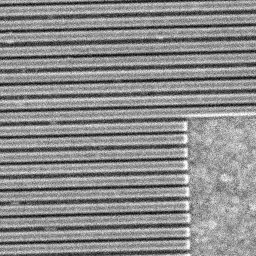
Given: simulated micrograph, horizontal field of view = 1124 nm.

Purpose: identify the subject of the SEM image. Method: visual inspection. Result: parallel lines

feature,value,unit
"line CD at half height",37.3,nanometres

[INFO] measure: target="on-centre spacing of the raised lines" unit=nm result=58.1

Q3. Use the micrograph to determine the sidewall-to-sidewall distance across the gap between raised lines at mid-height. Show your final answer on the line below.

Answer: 19.2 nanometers